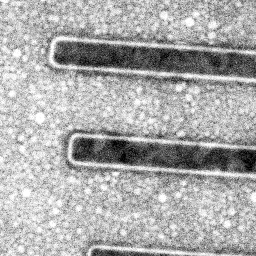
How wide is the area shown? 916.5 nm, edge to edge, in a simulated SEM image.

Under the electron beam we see one or a few lines or trenches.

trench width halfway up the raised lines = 0.24 µm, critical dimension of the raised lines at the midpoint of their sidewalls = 102 nanometres